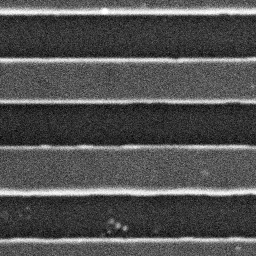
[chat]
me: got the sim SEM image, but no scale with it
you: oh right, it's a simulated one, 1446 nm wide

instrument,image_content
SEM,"lines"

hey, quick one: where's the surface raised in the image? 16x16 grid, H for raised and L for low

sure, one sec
HHHHHHHHHHHHHHHH
LLLLLLLLLLLLLLLL
LLLLLLLLLLLLLLLL
LLLLLLLLLLLLLLLL
HHHHHHHHHHHHHHHH
HHHHHHHHHHHHHHHH
LLLLLLLLLLLLLLLL
LLLLLLLLLLLLLLLL
LLLLLLLLLLLLLLLL
HHHHHHHHHHHHHHHH
HHHHHHHHHHHHHHHH
HHHHHHHHHHHHHHHH
LLLLLLLLLLLLLLLL
LLLLLLLLLLLLLLLL
LLLLLLLLLLLLLLLL
HHHHHHHHHHHHHHHH